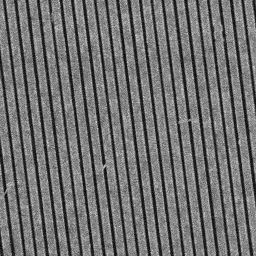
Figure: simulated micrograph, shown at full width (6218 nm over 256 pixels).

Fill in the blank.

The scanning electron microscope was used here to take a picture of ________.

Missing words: parallel lines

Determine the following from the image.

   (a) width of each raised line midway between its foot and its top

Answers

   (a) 181 nanometers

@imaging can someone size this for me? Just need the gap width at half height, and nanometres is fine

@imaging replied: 90.4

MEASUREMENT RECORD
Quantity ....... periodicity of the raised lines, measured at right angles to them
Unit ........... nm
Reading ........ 274